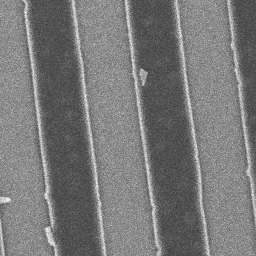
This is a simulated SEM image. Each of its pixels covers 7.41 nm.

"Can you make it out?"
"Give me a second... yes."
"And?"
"one or a few lines or trenches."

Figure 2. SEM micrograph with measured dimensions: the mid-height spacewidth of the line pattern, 377 nm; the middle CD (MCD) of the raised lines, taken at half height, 377 nm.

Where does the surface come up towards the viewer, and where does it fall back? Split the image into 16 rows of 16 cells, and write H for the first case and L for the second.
LLHHHLLLHHHLLLHH
LLHHHLLLHHHLLLHH
LLHHHLLLHHHLLLHH
LLHHHLLLHHHLLLLH
LLHHHLLLHHHHLLLH
LLHHHLLLLHHHLLLH
LLHHHLLLLHHHLLLH
LLHHHHLLLHHHLLLH
LLHHHHLLLHHHLLLH
LLLHHHLLLHHHLLLH
LLLHHHLLLHHHLLLL
LLLHHHLLLHHHHLLL
LLLHHHLLLHHHHLLL
LLLHHHLLLLHHHLLL
LLLHHHLLLLHHHLLL
LLLHHHHLLLHHHLLL